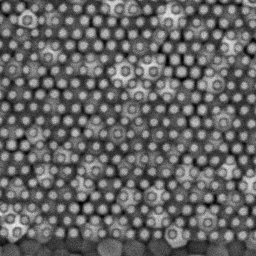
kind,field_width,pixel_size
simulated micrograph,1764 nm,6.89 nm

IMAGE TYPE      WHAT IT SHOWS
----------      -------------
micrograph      a regular array of raised bodies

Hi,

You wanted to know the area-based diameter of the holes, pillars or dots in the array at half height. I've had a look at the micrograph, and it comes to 47.3 nanometers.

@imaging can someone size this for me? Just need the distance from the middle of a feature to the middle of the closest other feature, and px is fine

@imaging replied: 13.6